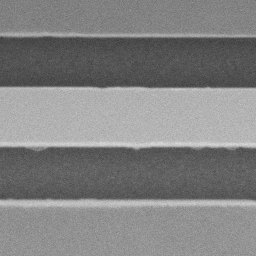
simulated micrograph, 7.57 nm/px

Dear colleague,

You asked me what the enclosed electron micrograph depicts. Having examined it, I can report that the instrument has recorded lines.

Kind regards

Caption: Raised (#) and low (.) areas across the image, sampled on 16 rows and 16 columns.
################
################
................
................
................
##########......
################
################
################
................
................
................
................
################
################
################